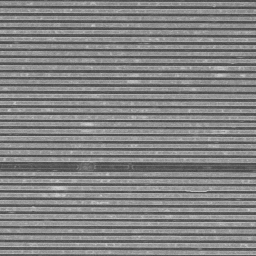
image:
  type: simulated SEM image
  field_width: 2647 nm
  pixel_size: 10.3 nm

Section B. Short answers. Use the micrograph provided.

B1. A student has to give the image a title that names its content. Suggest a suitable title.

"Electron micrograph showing parallel lines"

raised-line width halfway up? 41.3 nanometres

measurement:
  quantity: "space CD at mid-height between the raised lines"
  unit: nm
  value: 31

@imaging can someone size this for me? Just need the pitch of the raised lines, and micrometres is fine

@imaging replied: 0.0734